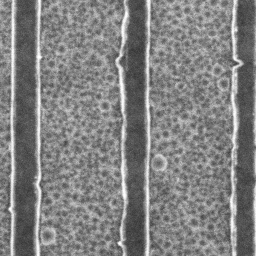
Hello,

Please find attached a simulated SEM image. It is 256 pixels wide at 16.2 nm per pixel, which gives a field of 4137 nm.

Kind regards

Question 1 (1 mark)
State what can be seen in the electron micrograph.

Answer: one or a few lines or trenches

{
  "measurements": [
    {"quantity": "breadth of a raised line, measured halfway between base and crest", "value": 422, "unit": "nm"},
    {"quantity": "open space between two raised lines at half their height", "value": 1360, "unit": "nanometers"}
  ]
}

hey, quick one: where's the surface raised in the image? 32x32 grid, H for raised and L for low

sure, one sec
LLHHHLLLLLLLLLLLHHHLLLLLLLLLLHHH
LLHHHLLLLLLLLLLLHHHLLLLLLLLLLHHH
LLHHHLLLLLLLLLLLHHHLLLLLLLLLLHHH
LLHHHLLLLLLLLLLHHHHLLLLLLLLLLHHH
LLHHHLLLLLLLLLLHHHHLLLLLLLLLLHHH
LLHHHLLLLLLLLLLHHHHLLLLLLLLLLHHH
LLHHHLLLLLLLLLLHHHLLLLLLLLLLLHHH
LLHHHLLLLLLLLLLHHHLLLLLLLLLLLLHH
LLHHHLLLLLLLLLLHHHLLLLLLLLLLLHHH
LLHHHLLLLLLLLLLHHHLLLLLLLLLLLHHH
LLHHHLLLLLLLLLLHHHLLLLLLLLLLLHHH
LLHHHLLLLLLLLLLHHHLLLLLLLLLLLHHH
LLHHHLLLLLLLLLLHHHLLLLLLLLLLLHHH
LLHHHLLLLLLLLLLHHHLLLLLLLLLLLHHH
LLHHHLLLLLLLLLLHHHHLLLLLLLLLLHHH
LLHHHLLLLLLLLLLHHHHLLLLLLLLLLHHH
LLHHHLLLLLLLLLLHHHHLLLLLLLLLLHHH
LLHHHLLLLLLLLLLHHHHLLLLLLLLLLHHH
LLHHHLLLLLLLLLLHHHHLLLLLLLLLLHHH
LLHHHLLLLLLLLLLHHHHLLLLLLLLLLHHH
LLHHHLLLLLLLLLLHHHHHLLLLLLLLLHHH
LLHHHLLLLLLLLLLHHHLLLLLLLLLLLHHH
LHHHHLLLLLLLLLLHHHLLLLLLLLLLLHHH
LHHHHLLLLLLLLLLHHHLLLLLLLLLLLHHH
LHHHHLLLLLLLLLLHHHLLLLLLLLLLLHHH
LHHHHLLLLLLLLLLLHHLLLLLLLLLLLHHH
LHHHHLLLLLLLLLLHHHLLLLLLLLLLLHHH
LLHHHLLLLLLLLLLHHHLLLLLLLLLLLHHH
LLHHHLLLLLLLLLLHHHLLLLLLLLLLLHHH
LLHHHHLLLLLLLLLHHHLLLLLLLLLLLHHH
LLHHHLLLLLLLLLLHHHLLLLLLLLLLLHHH
LLHHHLLLLLLLLLLHHHLLLLLLLLLLLHHH